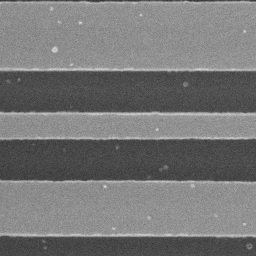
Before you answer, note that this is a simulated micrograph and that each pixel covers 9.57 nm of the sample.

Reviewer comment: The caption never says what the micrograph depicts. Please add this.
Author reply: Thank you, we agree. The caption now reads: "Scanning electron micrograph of lines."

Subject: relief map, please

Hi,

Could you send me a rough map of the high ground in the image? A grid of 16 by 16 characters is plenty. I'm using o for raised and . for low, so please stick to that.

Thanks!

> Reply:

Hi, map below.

oooooooooooooooo
oooooooooooooooo
oooooooooooooooo
oooooooooooooooo
................
................
................
oooooooooooooooo
oooooooooooooooo
................
................
oooooooooooooooo
oooooooooooooooo
oooooooooooooooo
oooooooooooooooo
................